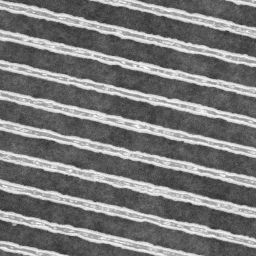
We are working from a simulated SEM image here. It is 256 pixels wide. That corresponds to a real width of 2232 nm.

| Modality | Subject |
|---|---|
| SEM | parallel lines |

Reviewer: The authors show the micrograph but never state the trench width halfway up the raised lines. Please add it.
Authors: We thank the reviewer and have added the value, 188 nanometers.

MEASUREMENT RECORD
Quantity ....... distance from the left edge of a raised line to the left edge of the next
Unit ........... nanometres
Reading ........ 256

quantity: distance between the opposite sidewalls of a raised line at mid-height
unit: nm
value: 62.7